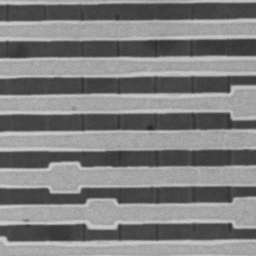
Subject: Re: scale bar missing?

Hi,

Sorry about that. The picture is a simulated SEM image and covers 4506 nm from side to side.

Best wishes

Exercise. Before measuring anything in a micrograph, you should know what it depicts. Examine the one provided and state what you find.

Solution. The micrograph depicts wiring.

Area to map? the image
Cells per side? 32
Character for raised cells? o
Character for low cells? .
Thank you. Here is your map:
................................
................................
................................
oooooooooooooooooooooooooooooooo
oooooooooooooooooooooooooooooooo
................................
................................
oooooooooooooooooooooooooooooooo
oooooooooooooooooooooooooooooooo
ooooooooooooooo.................
................................
.............................ooo
oooooooooooooooooooooooooooooooo
oooooooooooooooooooooooooooooooo
.............................ooo
................................
............oooooooooooooooooooo
oooooooooooooooooooooooooooooooo
oooooooooooooooooooooooooooooooo
................................
.......ooo......................
oooooooooooooooooooooooooooooooo
oooooooooooooooooooooooooooooooo
......oooo......................
................................
...........oooo..............ooo
oooooooooooooooooooooooooooooooo
oooooooooooooooooooooooooooooooo
................................
................................
oooooooo.ooo.ooooooooooooooooooo
oooooooooooooooooooooooooooooooo